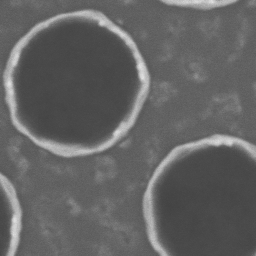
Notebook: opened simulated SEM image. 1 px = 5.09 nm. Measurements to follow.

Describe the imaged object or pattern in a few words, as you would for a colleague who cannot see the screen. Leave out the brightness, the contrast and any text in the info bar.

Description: raised bodies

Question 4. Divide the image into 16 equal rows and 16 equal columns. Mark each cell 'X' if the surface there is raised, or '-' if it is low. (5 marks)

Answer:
----------------
---XXXX---------
-XXXXXXX--------
-XXXXXXXX-------
-XXXXXXXX-------
XXXXXXXXX-------
-XXXXXXXX-------
-XXXXXXX--------
--XXXXX---------
----X------XXXXX
----------XXXXXX
---------XXXXXXX
X--------XXXXXXX
X--------XXXXXXX
X--------XXXXXXX
X---------XXXXXX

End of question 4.